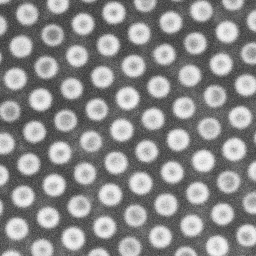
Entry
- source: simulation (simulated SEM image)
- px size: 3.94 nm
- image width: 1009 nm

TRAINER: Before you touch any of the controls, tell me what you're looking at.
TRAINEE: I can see a regular array of raised bodies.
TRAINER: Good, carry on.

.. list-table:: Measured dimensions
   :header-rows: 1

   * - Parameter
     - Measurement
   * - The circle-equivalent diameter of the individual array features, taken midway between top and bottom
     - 18.4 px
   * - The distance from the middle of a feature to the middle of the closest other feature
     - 129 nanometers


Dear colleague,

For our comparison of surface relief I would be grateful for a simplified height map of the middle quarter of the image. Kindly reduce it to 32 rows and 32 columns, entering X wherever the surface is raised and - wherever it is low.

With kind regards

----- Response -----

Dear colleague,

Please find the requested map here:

---------------XXXXX------------
--------XXX----XXXX-----------XX
-------XXXXX-----XX----------XXX
-------XXXXX-----------------XXX
XXX-----XXX-----------XXX-----XX
XXXX-----------------XXXXX------
XXXX-----------XX-----XXXX------
XXXX----------XXXX----XXX-------
--------------XXXX--------------
-------XX-----XXXX----------XXXX
------XXXX-----XX-----------XXXX
------XXXX------------------XXXX
XX----XXXX-----------XXX-----XX-
XXX-----------------XXXX--------
XXX-----------X-----XXXX--------
XX----------XXXX-----XXX--------
------------XXXXX---------------
------XX----XXXXX----------XXX--
-----XXXX----XX-----------XXXXX-
-----XXXX-----------------XXXXX-
-----XXXX----------XXX-----XXX--
X-----------------XXXXX---------
X-----------------XXXXX---------
X----------XXXX----XXX----------
-----------XXXX-----------------
----XX-----XXXX-----------XX----
---XXXX-----XX-----------XXXX---
---XXXX------------------XXXX---
---XXXX-----------XXX-----XXX---
-----X-----------XXXX-----------
-----------------XXXX-----------
----------XXX-----XXX----------X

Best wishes